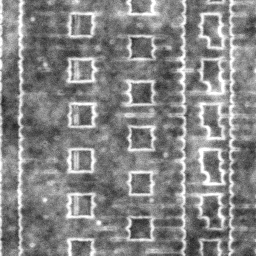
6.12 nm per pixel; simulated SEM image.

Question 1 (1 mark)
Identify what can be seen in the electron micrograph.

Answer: wiring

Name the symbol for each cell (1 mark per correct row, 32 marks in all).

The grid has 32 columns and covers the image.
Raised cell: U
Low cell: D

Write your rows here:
DDDUUUUUUUUUUUUUDDDUUUUDDDDDDUUU
DDDUUUUUUUUUUUUUUDDUUUUDDDDDDUUU
DDUUUUUUUDDDUUUUUUUUUUUDDDDDDUUU
DDUUUUUUUDDDUUUUUUUUUUUDDDDDDUUU
DDUUUUUUUDUUUUUUUUUUUUUDDDDDDUUU
DDUUUUUUUUUUUUUUDDDUUUUDDDDDDUUU
DDUUUUUUUUUUUUUUDDDUUUUDDDDDDUUU
DDUUUUUUUDDUUUUUUUUUUUUDDDDDDUUU
DDDUUUUUUDDDUUUUUUUUUUUDDDDDDUUU
DDDUUUUUUDDDUUUUUUUUUUUDDDDDDUUU
DDDUUUUUUUUUUUUUDDDUUUUDDDDDDUUU
DDDUUUUUUUUUUUUUDDDUUUUDDDDDDUUU
DDDUUUUUUUUUUUUUDDDUUUUDDDDDDUUU
DDUUUUUUUDDDUUUUUUUUUUUDDDDDDUUU
DDUUUUUUUDDDUUUUUUUUUUUDDDDDDUUU
DDUUUUUUUDDUUUUUUUUUUUUDDDDDDUUU
DDUUUUUUUUUUUUUUDDDUUUUDDDDDDUUU
DDUUUUUUUUUUUUUUDDDUUUUDDDDDDUUU
DDUUUUUUUUUUUUUUUDDUUUUDDDDDDUUU
DDUUUUUUUDDUUUUUUUUUUUUDDDDDDUUU
DDUUUUUUUDDUUUUUUUUUUUUDDDDDDUUU
DDUUUUUUUUUUUUUUUUUUUUUDDDDDDUUU
DDUUUUUUUUUUUUUUDDDUUUUDDDDDDUUU
DDUUUUUUUUUUUUUUDDDUUUUDDDDDDUUU
DDUUUUUUUDDUUUUUUUUUUUUDDDDDDUUU
DDUUUUUUUDDUUUUUUUUUUUUDDDDDDUUU
DDUUUUUUUDDUUUUUUUUUUUUDDDDDDUUU
DDUUUUUUUUUUUUUUDDDUUUUDDDDDDUUU
DDUUUUUUUUUUUUUUDDDUUUUDDDDDDUUU
DDUUUUUUUUUUUUUUDDDUUUUDDDDDDUUU
DDUUUUUUUDDUUUUUUUUUUUUDDDDDDUUU
DDUUUUUUUDDUUUUUUUUUUUUDDDDDDUUU